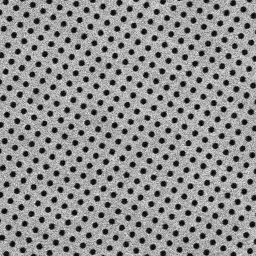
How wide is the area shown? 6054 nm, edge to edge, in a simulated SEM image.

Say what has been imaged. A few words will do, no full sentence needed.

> a regular array of holes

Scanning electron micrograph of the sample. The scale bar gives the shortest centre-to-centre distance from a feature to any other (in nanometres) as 277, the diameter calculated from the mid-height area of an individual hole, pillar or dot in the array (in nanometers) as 149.